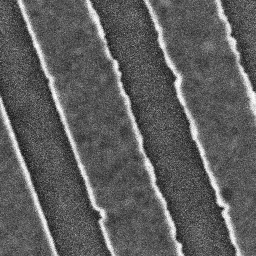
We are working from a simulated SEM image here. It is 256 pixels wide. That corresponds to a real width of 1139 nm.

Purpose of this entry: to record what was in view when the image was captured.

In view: one or a few lines or trenches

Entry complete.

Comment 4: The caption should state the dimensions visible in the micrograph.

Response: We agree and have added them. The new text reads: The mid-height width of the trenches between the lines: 235 nm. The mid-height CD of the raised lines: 0.297 microns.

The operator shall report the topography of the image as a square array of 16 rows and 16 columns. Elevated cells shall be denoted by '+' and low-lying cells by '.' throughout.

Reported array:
.+++++...+++++..
..++++....++++..
..+++++...+++++.
...++++...+++++.
...++++....++++.
...+++++...+++++
....++++...+++++
....++++....++++
+...+++++...++++
+....++++....+++
++...++++....+++
++...+++++...+++
++....++++....++
+++...+++++...++
+++....++++...++
+++....++++....+